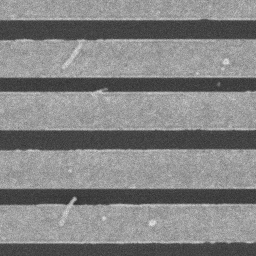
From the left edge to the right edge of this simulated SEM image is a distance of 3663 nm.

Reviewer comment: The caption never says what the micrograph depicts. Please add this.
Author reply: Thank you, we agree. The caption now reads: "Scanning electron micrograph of lines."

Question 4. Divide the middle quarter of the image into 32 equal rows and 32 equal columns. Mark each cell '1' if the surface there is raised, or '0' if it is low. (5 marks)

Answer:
11111111111111111111111111111111
11111111111111111111111111111111
11111111111111111111111111111111
00000000000000000000000000000000
00000000000000000000000000000000
00000000000000000000000000000000
00000000000000000000000000000000
11111111111111111111111111111111
11111111111111111111111111111111
11111111111111111111111111111111
11111111111111111111111111111111
11111111111111111111111111111111
11111111111111111111111111111111
11111111111111111111111111111111
11111111111111111111111111111111
11111111111111111111111111111111
00000000000000000000000000000000
00000000000000000000000000000000
00000000000000000000000000000000
00000000000000000000000000000000
00000000000000000000000000000000
00000000000000000000000000000000
11111111111111111111111111111111
11111111111111111111111111111111
11111111111111111111111111111111
11111111111111111111111111111111
11111111111111111111111111111111
11111111111111111111111111111111
11111111111111111111111111111111
11111111111111111111111111111111
11111111111111111111111111111111
00000000000000000000000000000000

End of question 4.